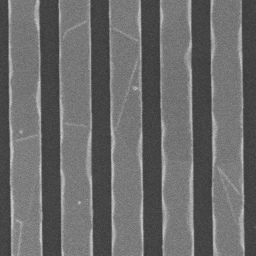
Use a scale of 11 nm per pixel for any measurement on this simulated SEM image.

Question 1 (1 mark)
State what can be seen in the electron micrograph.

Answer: wiring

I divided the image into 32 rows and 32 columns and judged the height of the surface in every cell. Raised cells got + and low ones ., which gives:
.++++..++++...+++...++++..++++..
.++++..++++...+++...++++..++++..
.++++...+++...+++...++++..++++..
.++++..++++...+++...++++..++++..
.++++...+++...++++..++++...+++..
.++++...+++...++++..++++...+++..
.++++...+++...++++..++++...+++..
.++++...+++...++++..+++...++++..
.++++...+++...++++..++++..++++..
.++++...+++...++++..++++..++++..
.++++...+++...++++..++++...+++..
.++++...+++...++++..++++...+++..
.++++...+++...++++..++++...+++..
.++++...+++...++++..++++...+++..
.++++...+++...++++..++++...+++..
.++++...+++...++++..++++...+++..
.++++...+++...++++..++++...+++..
.++++...+++...++++..++++...+++..
.++++...+++...+++...++++...+++..
.++++...+++...++++..++++...+++..
.++++...+++...++++...+++...+++..
.++++...+++...++++...+++...+++..
.++++...+++...++++..++++...+++..
.++++...+++...++++..++++...+++..
.++++...+++...++++..++++...+++..
.++++...+++...++++...+++...+++..
..+++...+++...++++...+++...+++..
..+++...+++...++++...+++...+++..
.++++...+++...++++...+++...+++..
.++++...+++...++++..++++...+++..
.++++...+++...++++..++++...+++..
.++++...+++...++++..++++...++++.